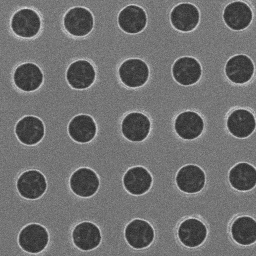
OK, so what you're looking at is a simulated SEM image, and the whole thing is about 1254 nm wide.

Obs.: a regular array of holes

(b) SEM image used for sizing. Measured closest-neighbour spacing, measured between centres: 259 nm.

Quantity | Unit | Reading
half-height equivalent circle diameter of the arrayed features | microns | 0.142